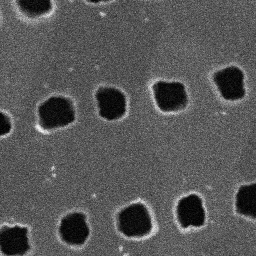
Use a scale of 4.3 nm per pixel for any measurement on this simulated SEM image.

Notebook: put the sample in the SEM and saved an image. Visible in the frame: holes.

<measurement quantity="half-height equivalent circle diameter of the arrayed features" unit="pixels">32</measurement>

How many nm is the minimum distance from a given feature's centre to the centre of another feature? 246